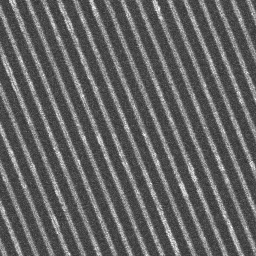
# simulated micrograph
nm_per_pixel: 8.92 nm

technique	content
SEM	parallel lines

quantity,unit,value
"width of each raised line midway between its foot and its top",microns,0.0383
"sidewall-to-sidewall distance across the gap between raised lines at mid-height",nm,89.9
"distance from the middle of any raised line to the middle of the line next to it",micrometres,0.13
